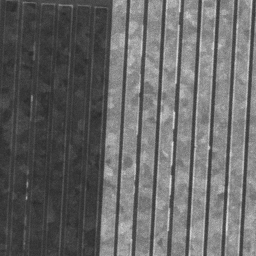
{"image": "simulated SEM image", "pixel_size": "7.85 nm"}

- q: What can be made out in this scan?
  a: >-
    parallel lines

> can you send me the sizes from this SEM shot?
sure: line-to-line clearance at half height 30.4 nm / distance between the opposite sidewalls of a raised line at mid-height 106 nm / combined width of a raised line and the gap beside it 141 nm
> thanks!